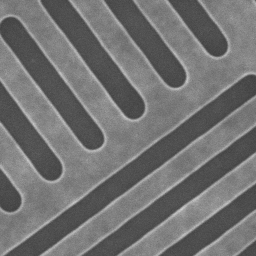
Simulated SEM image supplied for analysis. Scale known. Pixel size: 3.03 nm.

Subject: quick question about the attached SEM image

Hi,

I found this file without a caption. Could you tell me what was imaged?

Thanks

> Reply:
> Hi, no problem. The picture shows groups of lines, slits or small figures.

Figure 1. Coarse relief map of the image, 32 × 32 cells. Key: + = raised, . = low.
+++++....++++....++++....+++++++
++++++....++++....++++....++++++
..+++++....++++...+++++....+++++
...++++....+++++...+++++...+++++
....++++....++++....++++....++++
+....++++....++++....++++...++++
++...+++++...+++++...+++++..++++
++....++++....++++....++++++++++
+++....++++....++++....+++++++++
++++....++++....++++...++++++++.
+++++...+++++...+++++..++++++...
.++++....++++....+++++++++++....
..++++....++++....+++++++++....+
...++++....++++...+++++++.....++
...+++++...+++++..++++++....++++
....++++....+++++++++++....+++++
+....++++....++++++++.....+++++.
++....++++...+++++++....++++++..
+++...+++++.+++++++....+++++....
+++....++++++++++.....+++++....+
++++....++++++++....+++++.....++
+++++...+++++++....+++++.....+++
.+++++.++++++.....+++++....+++++
..++++++++++....++++++....+++++.
...++++++++....+++++.....+++++..
...++++++.....+++++....+++++....
+.++++++....++++++....+++++.....
+++++++....+++++.....+++++....++
+++++.....+++++....+++++.....+++
++++....+++++.....+++++.....++++
+++....+++++.....+++++....+++++.
+.....+++++....+++++.....+++++..